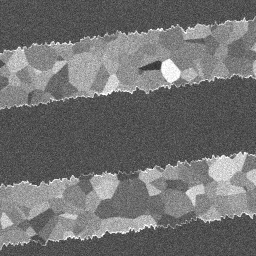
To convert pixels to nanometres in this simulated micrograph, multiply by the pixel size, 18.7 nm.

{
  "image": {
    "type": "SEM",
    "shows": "one or a few lines or trenches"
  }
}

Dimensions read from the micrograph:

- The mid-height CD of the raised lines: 1090 nanometers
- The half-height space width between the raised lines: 1480 nm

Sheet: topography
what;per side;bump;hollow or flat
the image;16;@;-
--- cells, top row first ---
----------------
--------------@@
-----@@@@@@@@@@@
@@@@@@@@@@@@@@@@
@@@@@@@@@@@@@@@@
@@@@@@@@@@------
@@--------------
----------------
----------------
----------------
----------@@@@@@
-@-@@@@@@@@@@@@@
@@@@@@@@@@@@@@@@
@@@@@@@@@@@@@@@-
@@@@@@@@--------
----------------